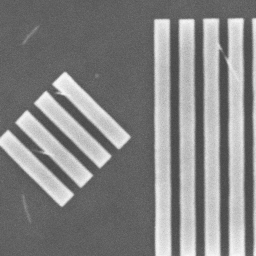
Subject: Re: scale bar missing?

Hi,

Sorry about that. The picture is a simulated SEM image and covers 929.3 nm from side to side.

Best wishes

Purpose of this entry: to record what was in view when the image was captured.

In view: groups of lines, slits or small figures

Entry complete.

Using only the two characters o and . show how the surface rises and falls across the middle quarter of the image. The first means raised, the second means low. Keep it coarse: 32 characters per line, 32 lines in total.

.......................ooo...ooo
.......................ooo...ooo
o......................ooo...ooo
oo.....................ooo...ooo
oo.....................ooo...ooo
ooo....................ooo...ooo
oooo...................ooo...ooo
oooooo.................ooo...ooo
.oooooo................ooo...ooo
..oooooo...............ooo...ooo
...oooooo..............ooo...ooo
....oooooo.............ooo...ooo
o....oooooo............ooo...ooo
oo....oooooo...........ooo...ooo
ooo....oooooo..........ooo...ooo
oooo....oooooo.........ooo...ooo
ooooo....oooooo........ooo...ooo
oooooo....oooooo.......ooo...ooo
.oooooo....ooooo.......ooo...ooo
..oooooo....ooo........ooo...ooo
...oooooo....o.........ooo...ooo
o...oooooo.............ooo...ooo
oo...oooooo............ooo...ooo
ooo...ooooo............ooo...ooo
oooo....oo.............ooo...ooo
ooooo..................ooo...ooo
oooooo.................ooo...ooo
.oooooo................ooo...ooo
..oooo.................ooo...ooo
...oo..................ooo...ooo
.......................ooo...ooo
o......................oooo..ooo